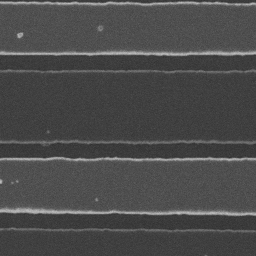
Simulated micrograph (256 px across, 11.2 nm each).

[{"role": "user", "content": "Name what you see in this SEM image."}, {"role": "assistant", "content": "lines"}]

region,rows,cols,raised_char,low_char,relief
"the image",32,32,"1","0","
11111111111111111101111111111001
11111111111111111111111111111111
11111111111111111111111111111111
11111111111111111111111111111111
11111111111111111111111111111111
11111111111111111111111111111111
11111111111111111111111111111111
00000000000000000000000000000000
00000000000000000000000000000000
11111111111111111111111111111111
11111111111111111111111111111111
11111111111111111111111111111111
11111111111111111111111111111111
11111111111111111111111111111111
11111111111111111111111111111111
11111111111111111111111111111111
11111111111111111111111111111111
11111111111111111111111111111111
00000000000000000000000000000000
00000000000000000000000000000000
11111111111111111111111111111111
11111111111111111111111111111111
11111111111111111111111111111111
11111111111111111111111111111111
11111111111111111111111111111111
11111111111111111111111111111111
11111111111111111111111111111111
00000000000000000000000000000000
00000000000000000000000000000000
11111111111111111111111111111111
11111111111111111111111111111111
11111111111111111111111111111111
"